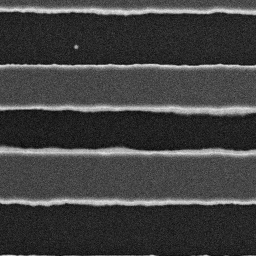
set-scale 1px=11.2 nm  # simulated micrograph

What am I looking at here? lines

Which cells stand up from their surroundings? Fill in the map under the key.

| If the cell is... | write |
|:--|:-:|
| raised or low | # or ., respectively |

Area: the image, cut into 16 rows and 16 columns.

################
................
................
................
################
################
################
................
................
####.#.#........
################
################
################
................
................
................